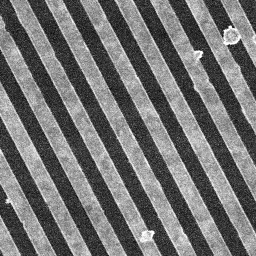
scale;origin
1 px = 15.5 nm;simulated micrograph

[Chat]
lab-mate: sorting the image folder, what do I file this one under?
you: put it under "parallel lines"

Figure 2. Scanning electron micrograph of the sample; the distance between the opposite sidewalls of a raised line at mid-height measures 221 nanometres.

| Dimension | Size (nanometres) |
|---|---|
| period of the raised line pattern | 480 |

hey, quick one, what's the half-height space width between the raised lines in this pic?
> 248 nanometers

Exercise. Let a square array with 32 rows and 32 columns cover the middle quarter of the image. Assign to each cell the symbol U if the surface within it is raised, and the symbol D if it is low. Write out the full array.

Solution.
DDDDUUUUDDDDDUUUUDDDDDUUUUDDDDUU
DDDDDUUUUDDDDUUUUUDDDDUUUUDDDDDU
DDDDDUUUUDDDDDUUUUDDDDDUUUUDDDDU
UDDDDDUUUUDDDDUUUUDDDDDUUUUDDDDD
UDDDDDUUUUDDDDDUUUUDDDDDUUUUDDDD
UUDDDDDUUUUDDDDUUUUDDDDDUUUUDDDD
UUUDDDDUUUUDDDDDUUUUDDDDDUUUUDDD
UUUDDDDDUUUUDDDDUUUUUDDDDUUUUDDD
UUUUDDDDUUUUDDDDDUUUUDDDDDUUUUDD
UUUUDDDDDUUUUDDDDDUUUUDDDDUUUUDD
UUUUUDDDDUUUUDDDDDUUUUDDDDDUUUUD
DUUUUDDDDDUUUUDDDDDUUUUDDDDUUUUD
DUUUUUDDDDUUUUDDDDDUUUUDDDDDUUUU
DDUUUUDDDDDUUUUDDDDDUUUUDDDDUUUU
DDDUUUUDDDDUUUUUDDDDUUUUDDDDDUUU
DDDUUUUDDDDDUUUUDDDDDUUUUDDDDUUU
DDDDUUUUDDDDUUUUUDDDDUUUUDDDDDUU
DDDDUUUUDDDDDUUUUDDDDDUUUUDDDDDU
DDDDDUUUUDDDDUUUUUDDDDUUUUDDDDDU
UDDDDUUUUDDDDDUUUUDDDDDUUUUDDDDD
UDDDDDUUUUDDDDDUUUUDDDDUUUUDDDDD
UUDDDDUUUUDDDDDUUUUDDDDDUUUUDDDD
UUDDDDDUUUUDDDDDUUUUDDDDUUUUDDDD
UUUDDDDUUUUDDDDDUUUUDDDDDUUUUDDD
UUUDDDDDUUUUDDDDDUUUUDDDDUUUUUDD
UUUUDDDDUUUUDDDDDUUUUDDDDDUUUUDD
UUUUDDDDDUUUUDDDDDUUUUDDDDUUUUUD
DUUUUDDDDUUUUUDDDDUUUUDDDDDUUUUD
DUUUUDDDDDUUUUDDDDDUUUUDDDDDUUUU
DDUUUUDDDDUUUUUDDDDUUUUDDDDDUUUU
DDUUUUDDDDDUUUUDDDDDUUUUDDDDDUUU
DDDUUUUDDDDUUUUUDDDDUUUUDDDDDUUU